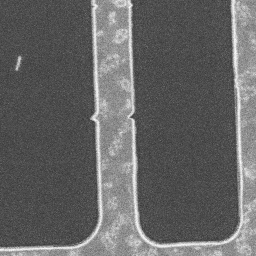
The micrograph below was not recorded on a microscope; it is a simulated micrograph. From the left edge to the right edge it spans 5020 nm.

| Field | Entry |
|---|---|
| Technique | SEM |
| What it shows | one or a few lines or trenches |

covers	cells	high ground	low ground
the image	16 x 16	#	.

......##.......#
......##.......#
......##.......#
......##.......#
......##.......#
......##.......#
......##.......#
......##.......#
......##.......#
......##.......#
......##.......#
......##.......#
......##.......#
......###......#
......###......#
...#############